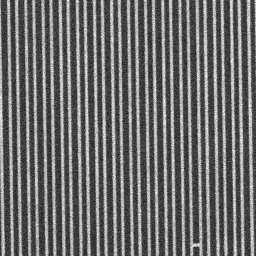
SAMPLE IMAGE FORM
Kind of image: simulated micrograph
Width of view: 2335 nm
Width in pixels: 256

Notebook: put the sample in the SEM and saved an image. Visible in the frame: parallel lines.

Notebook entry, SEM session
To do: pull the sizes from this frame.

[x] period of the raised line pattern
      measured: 78.2 nanometers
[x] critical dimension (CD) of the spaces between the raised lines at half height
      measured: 59.3 nm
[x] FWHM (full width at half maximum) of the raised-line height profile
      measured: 17.1 nm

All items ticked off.